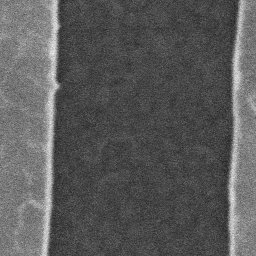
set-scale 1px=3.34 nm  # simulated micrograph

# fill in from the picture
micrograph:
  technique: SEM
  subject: one or a few lines or trenches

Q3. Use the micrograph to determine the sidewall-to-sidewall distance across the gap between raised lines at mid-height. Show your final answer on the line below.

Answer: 613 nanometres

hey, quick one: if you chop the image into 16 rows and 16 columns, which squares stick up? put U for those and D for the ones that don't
UUUDDDDDDDDDDDDU
UUUDDDDDDDDDDDDU
UUUDDDDDDDDDDDDU
UUUDDDDDDDDDDDDU
UUUDDDDDDDDDDDDU
UUUDDDDDDDDDDDDU
UUUDDDDDDDDDDDDU
UUUDDDDDDDDDDDDU
UUUDDDDDDDDDDDDU
UUUDDDDDDDDDDDDU
UUUDDDDDDDDDDDDU
UUUDDDDDDDDDDDUU
UUUDDDDDDDDDDDUU
UUUDDDDDDDDDDDUU
UUUDDDDDDDDDDDUU
UUUDDDDDDDDDDDUU